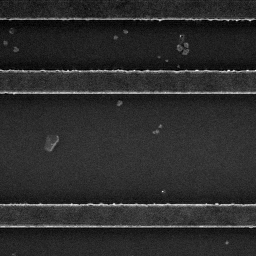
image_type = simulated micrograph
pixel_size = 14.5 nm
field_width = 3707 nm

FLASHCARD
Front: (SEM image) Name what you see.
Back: lines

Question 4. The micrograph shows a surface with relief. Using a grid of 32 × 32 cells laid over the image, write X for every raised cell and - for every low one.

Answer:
XXXXXXXXXXXXXXXXXXXXXXXXXXXXXXXX
XXXXXXXXXXXXXXXXXXXXXXXXXXXXXXXX
--------------------------------
--------------------------------
--------------------------------
--------------------------------
--------------------------------
--------------------------------
--------------------------------
XXXXXXXXXXXXXXXXXXXXXXXXXXXXXXXX
XXXXXXXXXXXXXXXXXXXXXXXXXXXXXXXX
XXXXXXXXXXXXXXXXXXXXXXXXXXXXXXXX
--------------------------------
--------------------------------
--------------------------------
--------------------------------
--------------------------------
--------------------------------
--------------------------------
--------------------------------
--------------------------------
--------------------------------
--------------------------------
--------------------------------
--------------------------------
-XXX-------XX-------X-----------
XXXXXXXXXXXXXXXXXXXXXXXXXXXXXXXX
XXXXXXXXXXXXXXXXXXXXXXXXXXXXXXXX
--------------------------------
--------------------------------
--------------------------------
--------------------------------